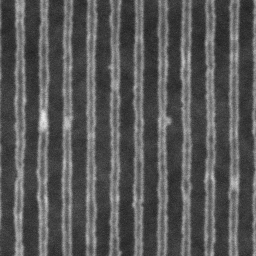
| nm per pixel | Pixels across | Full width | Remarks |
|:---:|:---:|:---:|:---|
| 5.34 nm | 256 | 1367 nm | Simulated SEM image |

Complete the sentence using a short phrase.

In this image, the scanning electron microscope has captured parallel lines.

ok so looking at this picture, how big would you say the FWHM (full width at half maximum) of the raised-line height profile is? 39.4 nm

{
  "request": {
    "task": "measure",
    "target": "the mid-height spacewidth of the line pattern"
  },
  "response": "86.8 nanometers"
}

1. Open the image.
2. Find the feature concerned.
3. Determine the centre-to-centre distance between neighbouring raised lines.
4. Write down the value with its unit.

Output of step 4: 127 nanometres